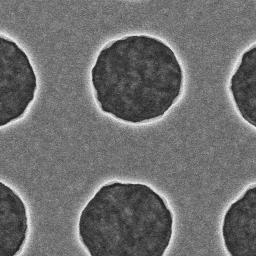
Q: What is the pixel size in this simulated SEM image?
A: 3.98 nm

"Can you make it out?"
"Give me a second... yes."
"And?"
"holes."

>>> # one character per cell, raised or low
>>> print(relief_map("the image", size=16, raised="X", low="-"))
XXXXXXXXXXXXXXXX
XXXXXXXXXXXXXXXX
-XXXXXX---XXXXXX
--XXXX-----XXXX-
--XXXX-----XXXX-
--XXXX-----XXX--
--XXXX-----XXXX-
-XXXXXXX-XXXXXX-
XXXXXXXXXXXXXXXX
XXXXXXXXXXXXXXXX
XXXXXXXXXXXXXXXX
XXXXXXX--XXXXXXX
-XXXXX----XXXXX-
--XXX------XXX--
--XXX------XXX--
-XXXX-----XXXX--